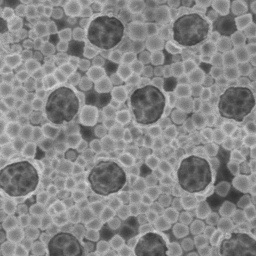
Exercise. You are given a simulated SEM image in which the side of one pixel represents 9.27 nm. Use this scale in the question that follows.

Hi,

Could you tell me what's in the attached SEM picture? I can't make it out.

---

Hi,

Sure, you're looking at a regular array of holes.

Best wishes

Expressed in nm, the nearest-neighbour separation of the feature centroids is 437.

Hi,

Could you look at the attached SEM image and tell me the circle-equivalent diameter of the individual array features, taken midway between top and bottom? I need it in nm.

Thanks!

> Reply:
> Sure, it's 294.